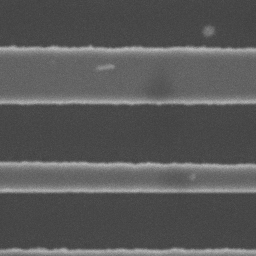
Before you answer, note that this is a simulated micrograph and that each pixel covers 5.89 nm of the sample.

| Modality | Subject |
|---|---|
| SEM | lines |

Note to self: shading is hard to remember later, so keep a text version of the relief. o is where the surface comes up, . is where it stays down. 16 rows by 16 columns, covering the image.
................
................
................
oooooooooooooooo
oooooooooooooooo
oooooooooooooooo
.o.o...ooooooo..
................
................
................
oooooooooooooooo
oooooooooooooooo
................
................
................
................